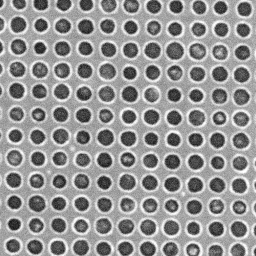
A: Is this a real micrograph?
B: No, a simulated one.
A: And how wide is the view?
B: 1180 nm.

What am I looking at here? a regular array of holes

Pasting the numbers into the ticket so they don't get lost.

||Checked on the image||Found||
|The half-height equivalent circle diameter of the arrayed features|74.1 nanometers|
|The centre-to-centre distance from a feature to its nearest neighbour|100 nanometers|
